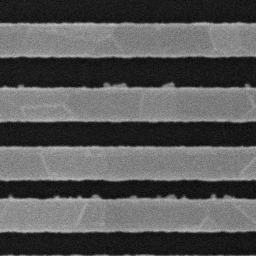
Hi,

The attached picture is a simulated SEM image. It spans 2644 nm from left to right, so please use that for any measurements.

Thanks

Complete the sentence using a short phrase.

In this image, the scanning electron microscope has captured lines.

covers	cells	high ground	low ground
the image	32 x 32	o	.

................................
................................
................................
oooooooooooooooooooooooooooooooo
oooooooooooooooooooooooooooooooo
oooooooooooooooooooooooooooooooo
oooooooooooooooooooooooooooooooo
................................
................................
................................
................................
oooooooooooooooooooooooooooooooo
oooooooooooooooooooooooooooooooo
oooooooooooooooooooooooooooooooo
oooooooooooooooooooooooooooooooo
................................
................................
................................
oooooooooooooooooooooooooooooooo
oooooooooooooooooooooooooooooooo
oooooooooooooooooooooooooooooooo
oooooooooooooooooooooooooooooooo
ooo.o.ooooo..ooo....ooo..ooooo..
................................
................................
oooooooooooooooooooooooooooooooo
oooooooooooooooooooooooooooooooo
oooooooooooooooooooooooooooooooo
oooooooooooooooooooooooooooooooo
................................
................................
................................